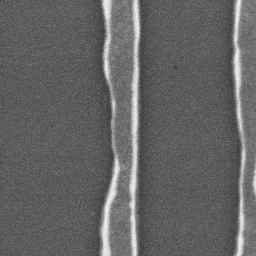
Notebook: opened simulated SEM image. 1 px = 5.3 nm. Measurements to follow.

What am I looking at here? one or a few lines or trenches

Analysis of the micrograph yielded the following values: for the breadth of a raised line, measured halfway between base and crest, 144 nanometres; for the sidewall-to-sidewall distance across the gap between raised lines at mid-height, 0.551 micrometres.